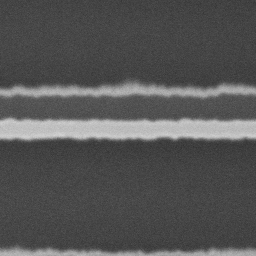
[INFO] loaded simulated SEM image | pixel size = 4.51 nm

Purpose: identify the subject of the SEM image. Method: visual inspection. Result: lines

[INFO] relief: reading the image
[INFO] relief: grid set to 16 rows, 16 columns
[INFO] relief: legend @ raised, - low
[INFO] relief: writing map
----------------
----------------
----------------
----------------
----------------
----------------
@@@@@@@@@@@@@@@@
@@@@@@@@@@@@@@@@
@@@@@@@@@@@@@@@@
----------------
----------------
----------------
----------------
----------------
----------------
----------------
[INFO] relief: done